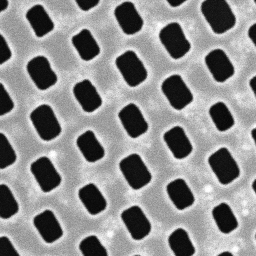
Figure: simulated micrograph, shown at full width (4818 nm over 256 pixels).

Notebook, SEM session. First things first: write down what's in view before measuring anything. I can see a regular array of holes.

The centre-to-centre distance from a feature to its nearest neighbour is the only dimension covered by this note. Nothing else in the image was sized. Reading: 947 nanometres